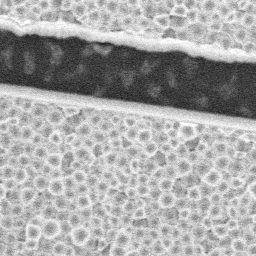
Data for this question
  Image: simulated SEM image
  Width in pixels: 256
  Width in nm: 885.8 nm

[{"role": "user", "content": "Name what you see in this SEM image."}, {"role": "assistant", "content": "one or a few lines or trenches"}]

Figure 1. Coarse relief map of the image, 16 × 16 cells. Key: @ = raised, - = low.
@@@@@@@@@@@@@@@@
@@@@@@@@@@@@@@@@
-------@@@@@@@@@
--------------@@
----------------
----------------
@@@@@@@---------
@@@@@@@@@@@@@@--
@@@@@@@@@@@@@@@@
@@@@@@@@@@@@@@@@
@@@@@@@@@@@@@@@@
@@@@@@@@@@@@@@@@
@@@@@@@@@@@@@@@@
@@@@@@@@@@@@@@@@
@@@@@@@@@@@@@@@@
@@@@@@@@@@@@@@@@